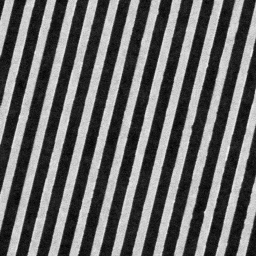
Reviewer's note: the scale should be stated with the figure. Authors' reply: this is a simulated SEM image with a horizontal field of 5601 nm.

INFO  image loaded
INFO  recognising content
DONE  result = parallel lines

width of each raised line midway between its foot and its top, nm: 167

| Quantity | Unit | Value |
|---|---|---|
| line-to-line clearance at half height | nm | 271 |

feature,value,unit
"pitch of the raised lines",444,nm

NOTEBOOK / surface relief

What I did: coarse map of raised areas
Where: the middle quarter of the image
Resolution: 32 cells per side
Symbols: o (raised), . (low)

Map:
..oo....oo...oo...oo...oo....oo.
..oo...oo....oo...oo...oo...oo..
..oo...oo...oo....o....oo...oo..
..oo...oo...oo...oo....oo...oo..
..o....oo...oo...oo...oo....oo..
.oo...oo....oo...oo...oo...oo...
.oo...oo...oo....oo...oo...oo...
.oo...oo...oo...oo....oo...oo...
.o....oo...oo...oo...oo....oo...
oo...oo....oo...oo...oo...oo....
oo...oo...oo....oo...oo...oo...o
oo...oo...oo...oo....oo...oo...o
o....oo...oo...oo...oo....oo...o
o...ooo...oo...oo...oo...oo....o
o...oo....o....oo...oo...oo...oo
o...oo...oo...oo....oo...oo...oo
o...oo...oo...oo...oo....oo...oo
....oo...oo...oo...oo...oo....oo
...oo....o....oo...oo...oo...oo.
...oo...oo...oo....oo...oo...oo.
...oo...oo...oo....o....oo...oo.
...oo...oo...oo...oo...oo....oo.
..oo....o....oo...oo...oo...oo..
..oo...oo....oo...oo...oo...oo..
..oo...oo...oo....o....oo...oo..
..oo...oo...oo...oo...oo....oo..
.oo....oo...oo...oo...oo....o...
.oo...oo....o....oo...oo...oo...
.oo...oo...oo....o....oo...oo...
.oo...oo...oo...oo....oo...oo...
oo....oo...oo...oo...oo....o....
oo...oo....oo...oo...oo...oo...o